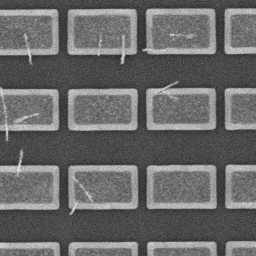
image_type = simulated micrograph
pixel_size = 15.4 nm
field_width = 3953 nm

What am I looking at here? wiring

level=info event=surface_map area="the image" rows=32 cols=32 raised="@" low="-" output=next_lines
--------------------------------
-----------------------@@@---@@@
@@@@@@@--@@@@@@@@--@@@@@@@@-@@@@
@@@@@@@--@@@@@@@@--@@@@@@@@-@@@@
@@@@@@@--@@@@@@@@--@@@@@@@@-@@@@
@@@@@@@--@@@@@@@@--@@@@@@@@-@@@@
---@--------@--@----------------
--------------------------------
--------------------------------
--------------------------------
--------------------------------
@-------------@@---@@@@@@@---@@@
@@@@@@@--@@@@@@@@--@@@@@@@@-@@@@
@@@@@@@--@@@@@@@@--@@@@@@@@-@@@@
@@@@@@@--@@@@@@@@--@@@@@@@@-@@@@
@@@@@@@--@@@@@@@@--@@@@@@@@--@@@
--------------------------------
--------------------------------
--------------------------------
--------------------------------
--------------------------------
@@@@@@@--@@@@@@@@--@@@@@@@@--@@@
@@@@@@@--@@@@@@@@--@@@@@@@@--@@@
@@@@@@@--@@@@@@@@--@@@@@@@@--@@@
@@@@@@@--@@@@@@@@--@@@@@@@@--@@@
@@@@@@@--@@@@@@@@--@@@@@@@@--@@@
--------------------------------
--------------------------------
--------------------------------
--------------------------------
--------------------------------
@@@@@@@--@@@@@@@@--@@@@@@@@--@@@